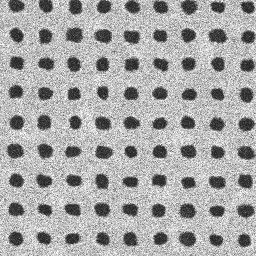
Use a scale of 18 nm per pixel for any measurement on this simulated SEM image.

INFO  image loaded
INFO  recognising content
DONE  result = a regular array of holes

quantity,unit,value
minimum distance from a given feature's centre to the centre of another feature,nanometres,506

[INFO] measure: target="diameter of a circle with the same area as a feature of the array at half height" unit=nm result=257